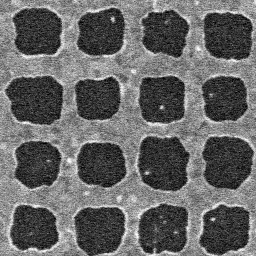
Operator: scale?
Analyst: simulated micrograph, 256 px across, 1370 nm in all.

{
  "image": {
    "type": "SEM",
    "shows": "a regular array of holes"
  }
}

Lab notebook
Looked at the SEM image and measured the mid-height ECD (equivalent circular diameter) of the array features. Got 0.271 micrometres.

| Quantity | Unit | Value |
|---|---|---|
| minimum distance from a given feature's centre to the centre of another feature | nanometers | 337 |